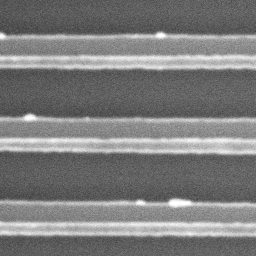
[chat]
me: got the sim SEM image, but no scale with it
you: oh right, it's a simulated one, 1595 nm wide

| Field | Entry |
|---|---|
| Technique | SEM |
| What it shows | lines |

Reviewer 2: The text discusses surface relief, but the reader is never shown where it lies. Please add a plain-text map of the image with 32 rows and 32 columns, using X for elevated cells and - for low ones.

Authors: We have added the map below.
--------------------------------
--------------------------------
--------------------------------
--------------------------------
X---------------X--XX-----------
XXXXXXXXXXXXXXXXXXXXXXXXXXXXXXXX
XXXXXXXXXXXXXXXXXXXXXXXXXXXXXXXX
XXXXXXXXXXXXXXXXXXXXXXXXXXXXXXXX
--------X-XXX-----XXX-----XX-X-X
--------------------------------
--------------------------------
--------------------------------
--------------------------------
--------------------------------
---X----------------------------
XXXXXXXXXXXXXXXXXXXXXXXXXXXXXXXX
XXXXXXXXXXXXXXXXXXXXXXXXXXXXXXXX
XXXXXXXXXXXXXXXXXXXXXXXXXXXXXXXX
XXXXXXXXXXXXXXXXXXXXXXXXXXXXXXXX
--------------------------------
--------------------------------
--------------------------------
--------------------------------
--------------------------------
--------------------------------
XXXXXXXXXXXXXXXXXXXX-XXXX-------
XXXXXXXXXXXXXXXXXXXXXXXXXXXXXXXX
XXXXXXXXXXXXXXXXXXXXXXXXXXXXXXXX
XXXXXXXXXXXXXXXXXXXXXXXXXXXXXXXX
--------------------------------
--------------------------------
--------------------------------